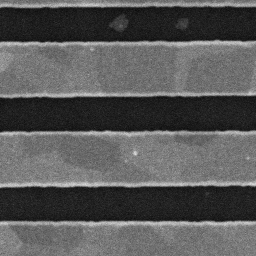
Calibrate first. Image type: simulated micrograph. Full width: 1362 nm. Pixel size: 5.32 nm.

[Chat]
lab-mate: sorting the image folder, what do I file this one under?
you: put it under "lines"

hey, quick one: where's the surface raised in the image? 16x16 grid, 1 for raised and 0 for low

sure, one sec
0000000000000000
0000000000000000
0000000000000000
1111111111111111
1111111111111111
1111111111111111
0000000000000000
0000000000000000
1111111111111111
1111111111111111
1111111111111111
1111111111111111
0000000000000000
0000000000000000
1111111111111111
1111111111111111